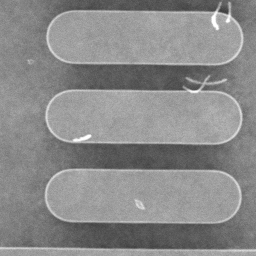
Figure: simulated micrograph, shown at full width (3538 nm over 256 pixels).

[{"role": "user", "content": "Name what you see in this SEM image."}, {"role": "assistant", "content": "groups of lines, slits or small figures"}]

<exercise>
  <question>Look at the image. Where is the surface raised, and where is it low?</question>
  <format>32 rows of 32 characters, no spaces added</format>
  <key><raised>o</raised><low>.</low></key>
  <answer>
................................
........oooooooooooooooo..o.....
.......oooooooooooooooooooooo...
......oooooooooooooooooooooooo..
......oooooooooooooooooooooooo..
......oooooooooooooooooooooooo..
.......ooooooooooooooooooooooo..
........ooooooooooooooooooooo...
................................
................................
................................
........ooooooooooooooooooo.....
.......oooooooooooooooooooooo...
......oooooooooooooooooooooooo..
......oooooooooooooooooooooooo..
......oooooooooooooooooooooooo..
......oooooooooooooooooooooooo..
........ooooooooooooooooooooo...
................................
................................
................................
........oooooooooooooooooooo....
......ooooooooooooooooooooooo...
......oooooooooooooooooooooooo..
......oooooooooooooooooooooooo..
......oooooooooooooooooooooooo..
......ooooooooooooooooooooooo...
........oooooooooooooooooooo....
................................
................................
................................
oooooooooooooooooooooooooooooooo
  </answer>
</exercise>